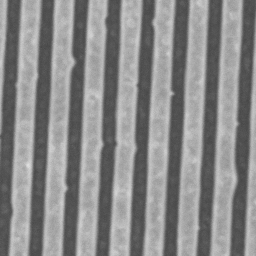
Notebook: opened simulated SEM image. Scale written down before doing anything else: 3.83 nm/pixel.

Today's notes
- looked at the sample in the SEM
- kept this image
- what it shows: parallel lines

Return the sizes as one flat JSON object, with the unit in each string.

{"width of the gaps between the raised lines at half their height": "0.0578 µm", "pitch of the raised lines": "33.6 px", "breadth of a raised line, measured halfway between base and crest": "72.2 nanometers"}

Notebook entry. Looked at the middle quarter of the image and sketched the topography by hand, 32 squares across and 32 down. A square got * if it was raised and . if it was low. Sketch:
**...*****....*****....****....*
**...*****....****....*****....*
*....*****....****....*****....*
*....*****....****....*****....*
*....*****....****....*****....*
*....*****....****....*****....*
*....*****....****....*****...**
*....*****....****....*****...**
*....*****....****....****....**
*....*****....****....****....**
*....*****....****....*****...**
*....****....*****....****....**
*....****....*****....****....**
*....****....*****....****....**
*....****....*****....****....**
*....****....*****....****....**
*....****....*****...*****....**
*....****....*****...*****....**
*....****....*****...*****....**
*....*****...*****...*****....**
*....****....*****...*****....**
.....****....*****...*****....**
.....****....*****...*****....**
*....****....****....*****....**
*....****....****....*****....**
*...*****....****....*****...***
....*****....****....*****...***
....*****....****....****....***
....*****....****....****....***
....*****....****....****....***
*...*****....****....****....***
*...****....*****....****....***